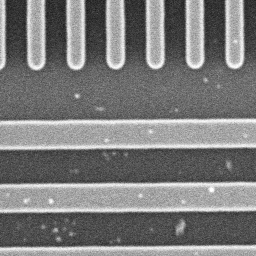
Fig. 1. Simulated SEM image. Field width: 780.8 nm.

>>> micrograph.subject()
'groups of lines, slits or small figures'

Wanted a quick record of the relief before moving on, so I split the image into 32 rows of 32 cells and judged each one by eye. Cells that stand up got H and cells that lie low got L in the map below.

HLLHHLLLHHLLLHHLLLHHLLLHHLLLHHLL
HLLHHLLLHHHLLHHHLLHHLLLHHLLLHHLL
HLLHHLLLHHLLLHHHLLHHLLLHHLLLHHLL
HLLHHLLLHHHLLHHHLLHHLLLHHLLLHHLL
HLLHHLLLHHHLLHHHLLHHLLLHHLLLHHLL
HLLHHLLLLHHLLHHHLLHHLLLHHLLLHHLL
HLLLHLLLLHHLLHHHLLHHLLLHHLLLHHLL
HLLLHLLLLHHLLHHHLLHHLLLHHLLLHHLL
LLLLHLLLLHLLLLHLLLLLLLLLLLLLLLLL
LLLLLLLLLLLLLLLLLLLLLLLLLLLLLLLL
LLLLLLLLLLLLLLLLLLLLLLLLLLLLLLLL
LLLLLLLLLLLLLLLLLLLLLLLLLLLLLLLL
LLLLLLLLLLLLLLLLLLLLLLLLLLLLLLLL
LLLLLLLLLLLLLLLLLLLLLLLLLLLLLLLL
LLLLLLLLLLLLLLLLLLLLLLLLLLLLLLLL
HHHHHHHHHHHHHHHHHHHHHHHHHHHHHHHH
HHHHHHHHHHHHHHHHHHHHHHHHHHHHHHHH
HHHHHHHHHHHHHHHHHHHHHHHHHHHHHHHH
HHHHHHHHHHHLLLLLLLLLLLLLLLLLLLLL
LLLLLLLLLLLLLLLLLLLLLLLLLLLLLLLL
LLLLLLLLLLLLLLLLLLLLLLLLLLLLLLLL
LLLLLLLLLLLLLLLLLLLLLLLLLLLLLLLL
LLLLLLLLLLLLLLLLLLLLLLLLLLLLLLLL
HHHHHHHHHHHHHHHHHHHHHHHHHHHHHHHH
HHHHHHHHHHHHHHHHHHHHHHHHHHHHHHHH
HHHHHHHHHHHHHHHHHHHHHHHHHHHHHHHH
LLLLLLLLLLLLLLLLLLLLLLLLLLLLLLLL
LLLLLLLLLLLLLLLLLLLLLLLLLLLLLLLL
LLLLLLLLLLLLLLLLLLLLLLLLLLLLLLLL
LLLLLLLLLLLLLLLLLLLLLLLLLLLLLLLL
LLLLLLLLLLLLLLLLLLLLLLLLLLLLLLLL
HHHHHHHHHHHHHHHHHHHHHHHHHHHHHHHH